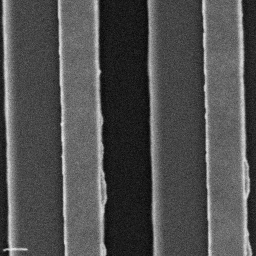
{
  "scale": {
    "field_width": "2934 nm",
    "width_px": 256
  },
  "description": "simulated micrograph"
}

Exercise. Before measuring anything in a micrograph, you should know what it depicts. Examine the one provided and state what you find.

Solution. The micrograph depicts lines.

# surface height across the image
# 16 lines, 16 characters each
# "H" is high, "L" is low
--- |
HHHHHHLLLHHHHHHL
HHHHHHLLLHHHHHHL
HHHHHHLLLHHHHHHL
HHHHHHLLLHHHHHHL
HHHHHHLLLHHHHHHL
HHHHHHLLLHHHHHHL
HHHHHHLLLLHHHHHL
LHHHHHLLLLHHHHHL
LHHHHHLLLLHHHHHL
LHHHHHLLLLHHHHHL
LHHHHHLLLLHHHHHH
LHHHHHHLLLHHHHHH
LHHHHHHLLLHHHHHL
LHHHHHLLLLHHHHHL
LHHHHHLLLLHHHHHL
LHHHHHHLLLHHHHHH